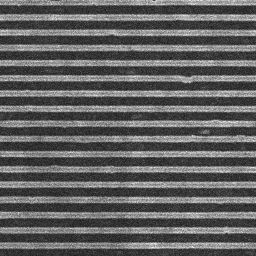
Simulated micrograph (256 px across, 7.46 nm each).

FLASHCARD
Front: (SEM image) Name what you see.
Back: parallel lines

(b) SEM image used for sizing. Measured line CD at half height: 33.6 nm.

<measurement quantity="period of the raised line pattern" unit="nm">114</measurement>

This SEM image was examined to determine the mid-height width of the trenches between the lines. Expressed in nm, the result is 73.7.